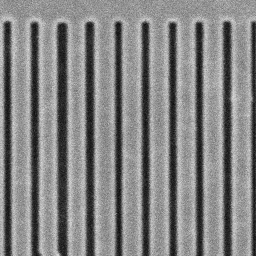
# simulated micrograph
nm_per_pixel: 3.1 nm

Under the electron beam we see parallel lines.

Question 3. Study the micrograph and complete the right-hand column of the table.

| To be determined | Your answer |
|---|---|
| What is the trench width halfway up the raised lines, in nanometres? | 23.6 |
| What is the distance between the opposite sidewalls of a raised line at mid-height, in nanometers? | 59.3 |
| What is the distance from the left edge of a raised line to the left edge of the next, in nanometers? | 85.4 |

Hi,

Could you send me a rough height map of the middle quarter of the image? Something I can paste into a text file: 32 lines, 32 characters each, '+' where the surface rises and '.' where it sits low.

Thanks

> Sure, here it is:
.++++...+++++..++++..+++++..++++
.++++...+++++..++++..+++++..++++
.++++...+++++..++++..+++++..++++
.++++...+++++..++++..+++++..++++
.++++...+++++..++++..+++++..++++
.++++...+++++..++++..+++++..++++
.++++...+++++..++++..+++++..++++
.++++...+++++..++++..+++++..++++
.++++...+++++..++++..+++++..++++
.++++...+++++..++++..+++++..++++
.++++...+++++..++++..+++++..++++
.++++...+++++..++++..+++++..++++
.++++...+++++..++++..+++++..++++
.++++...+++++..++++..+++++..++++
.++++...+++++..++++..+++++..++++
.++++...+++++..++++..+++++..++++
.++++...+++++..++++..+++++..++++
.++++...+++++..++++..+++++..++++
.++++...+++++..++++..+++++..++++
.++++...+++++..++++..+++++..++++
.++++...+++++..++++..+++++..++++
.++++...+++++..++++..+++++..++++
.++++...+++++..++++..+++++..++++
.++++...+++++..++++..+++++..++++
.++++...+++++..++++..+++++..++++
.++++...+++++..++++..+++++..++++
.++++...+++++..++++..+++++..++++
.++++...+++++..++++..+++++..++++
.++++...+++++..++++..+++++..++++
.++++...+++++..++++..+++++..++++
.++++...+++++..++++..+++++..++++
.++++...+++++..++++..+++++..++++